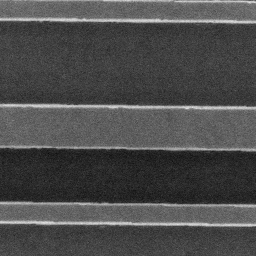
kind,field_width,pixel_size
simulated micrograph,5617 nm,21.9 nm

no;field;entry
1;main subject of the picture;lines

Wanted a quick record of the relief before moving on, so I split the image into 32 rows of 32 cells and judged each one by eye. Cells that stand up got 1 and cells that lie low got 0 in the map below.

11111111111111111111111111111111
11111111111111111111111111111111
00000000000000001111111111111111
00000000000000000000000000000000
00000000000000000000000000000000
00000000000000000000000000000000
00000000000000000000000000000000
00000000000000000000000000000000
00000000000000000000000000000000
00000000000000000000000000000000
00000000000000000000000000000000
00000000000000000000000000000000
00000000000000000000000000000000
11111111111111111100000000000000
11111111111111111111111111111111
11111111111111111111111111111111
11111111111111111111111111111111
11111111111111111111111111111111
00000000000001111111111111111111
00000000000000000000000000000000
00000000000000000000000000000000
00000000000000000000000000000000
00000000000000000000000000000000
00000000000000000000000000000000
00000000000000000000000000000000
11110000000000000000000000000000
11111111111111111111111111111111
11111111111111111111111111111111
00000000000000000000000000000000
00000000000000000000000000000000
00000000000000000000000000000000
00000000000000000000000000000000